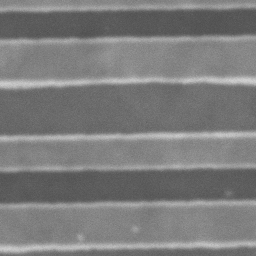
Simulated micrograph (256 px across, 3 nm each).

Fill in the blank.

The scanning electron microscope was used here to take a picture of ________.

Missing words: lines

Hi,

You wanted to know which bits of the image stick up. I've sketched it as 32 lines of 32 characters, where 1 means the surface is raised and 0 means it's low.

11111111111111111111111111111111
00000000000000000000000000000000
00000000000000000000000000000000
00000000000000000000000000000000
00000000000000000000000000000000
11111111111111111111111111111111
11111111111111111111111111111111
11111111111111111111111111111111
11111111111111111111111111111111
11111111111111111111111111111111
11110000000000000000000000000000
00000000000000000000000000000000
00000000000000000000000000000000
00000000000000000000000000000000
00000000000000000000000000000000
00000000000000000000000000000000
00000000000000000000000000000000
11111111111111111111111111111111
11111111111111111111111111111111
11111111111111111111111111111111
11111111111111111111111111111111
00000000000000000000000000000000
00000000000000000000000000000000
00000000000000000000000000000000
00000000000000000000000000000000
00000000010111111111111111111111
11111111111111111111111111111111
11111111111111111111111111111111
11111111111111111111111111111111
11111111111111111111111111111111
11111111111111111111111111111111
00000000000000000000000000000000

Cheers